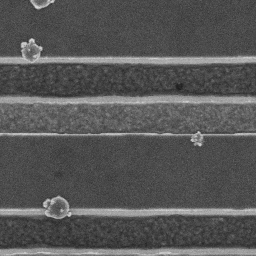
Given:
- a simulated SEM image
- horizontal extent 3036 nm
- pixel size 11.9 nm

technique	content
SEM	lines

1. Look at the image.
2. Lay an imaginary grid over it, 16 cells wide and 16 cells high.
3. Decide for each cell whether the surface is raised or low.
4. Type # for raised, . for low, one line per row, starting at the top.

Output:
################
################
################
################
................
................
................
................
################
################
################
################
################
...#............
................
................